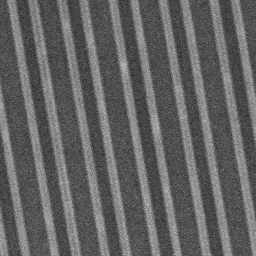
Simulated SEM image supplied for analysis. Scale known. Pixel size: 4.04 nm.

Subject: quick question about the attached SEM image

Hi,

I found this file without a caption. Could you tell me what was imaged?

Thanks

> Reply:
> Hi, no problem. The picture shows parallel lines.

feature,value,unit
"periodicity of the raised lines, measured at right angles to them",0.101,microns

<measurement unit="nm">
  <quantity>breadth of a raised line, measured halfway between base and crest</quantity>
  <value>27.8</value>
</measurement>